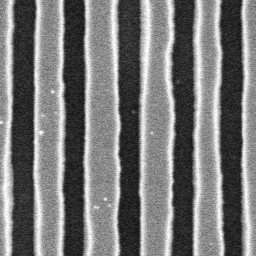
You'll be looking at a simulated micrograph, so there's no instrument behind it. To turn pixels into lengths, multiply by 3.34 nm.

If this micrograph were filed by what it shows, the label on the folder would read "lines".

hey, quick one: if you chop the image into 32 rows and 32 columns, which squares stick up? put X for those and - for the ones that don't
XX---XXX---XXX----XXXX---XX---XX
X----XXX---XXX----XXXX---XX---XX
X----XXX---XXX----XXXX--XXX---XX
XX---XXX---XXX----XXXX--XXX---XX
X---XXXX---XXX----XXXX--XXX---XX
X---XXXX---XXX----XXXX--XXXX--XX
X---XXXX---XXXX---XXX---XXXX--XX
X---XXXX---XXXX---XXX---XXXX--XX
X---XXXX---XXXX---XXX---XXXX--XX
X---XXXX---XXXX---XXX---XXXX--XX
X---XXXX---XXXX---XXX---XXX---XX
X---XXXX---XXXX---XXX----XX---XX
X---XXXX---XXXX---XXXX---XX---XX
X---XXXX---XXXX---XXXX--XXX---XX
X---XXXX---XXXX---XXXX--XXX---XX
X---XXXX---XXXX---XXXX--XXX---XX
X---XXXX---XXXX---XXXX--XXX---XX
X---XXXX---XXXX---XXXX--XXX---XX
X---XXXX---XXXX---XXXX--XXX---XX
X---XXXX---XXXX---XXX---XXX---XX
X---XXXX---XXXX---XXXX--XXX---XX
X---XXXX---XXXX---XXXX--XXXX--XX
X---XXXX---XXXX---XXXX--XXXX--XX
X---XXXX---XXXX--XXXX---XXXX--XX
X---XXXX---XXXX---XXXX--XXXX--XX
X----XXX---XXXX---XXX---XXXX--XX
X----XXX---XXXX---XXXX--XXXX--XX
X----XXX---XXXX---XXX---XXXX--XX
X----XXX---XXXX---XXX---XXXX---X
X----XXX---XXXX---XXX---XXXX---X
X----XXX---XXXX---XXX---XXXX---X
X----XXX---XXXX---XXX---XXXX---X